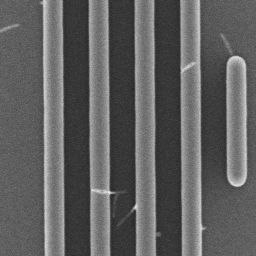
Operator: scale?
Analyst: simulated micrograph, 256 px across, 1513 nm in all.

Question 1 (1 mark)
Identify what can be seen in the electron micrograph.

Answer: groups of lines, slits or small figures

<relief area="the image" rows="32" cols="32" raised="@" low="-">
------@@---@@----@@----@@-------
------@@---@@----@@----@@-------
------@@---@@----@@----@@-------
------@@---@@----@@----@@-------
------@@---@@----@@----@@-------
------@@---@@----@@----@@-------
------@@---@@----@@----@@-------
------@@---@@----@@----@@----@--
------@@---@@----@@----@@---@@@-
------@@---@@----@@----@@---@@@-
------@@---@@@---@@----@@---@@@-
------@@---@@@---@@----@@---@@@-
------@@---@@@---@@----@@---@@@-
------@@---@@@---@@----@@---@@@-
------@@---@@@---@@----@@---@@@-
------@@---@@@---@@----@@---@@@-
------@@---@@@---@@----@@---@@@-
------@@---@@@---@@----@@---@@@-
------@@---@@@---@@----@@---@@@-
------@@---@@@---@@----@@---@@@-
------@@---@@@---@@----@@---@@@-
------@@---@@@---@@----@@---@@@-
------@@---@@@---@@----@@----@@-
------@@---@@@---@@----@@-------
------@@---@@@---@@----@@-------
------@@---@@@---@@----@@-------
------@@---@@@---@@----@@-------
------@@---@@@---@@----@@-------
------@@---@@@---@@----@@-------
------@@---@@@---@@----@@-------
------@@---@@@---@@----@@-------
------@@---@@@---@@----@@-------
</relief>